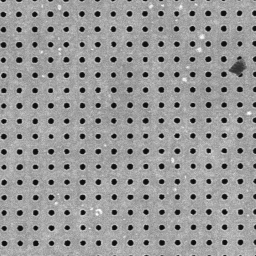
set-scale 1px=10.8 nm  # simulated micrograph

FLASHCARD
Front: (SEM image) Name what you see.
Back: a regular array of holes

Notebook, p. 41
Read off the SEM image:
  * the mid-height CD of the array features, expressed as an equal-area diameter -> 58.3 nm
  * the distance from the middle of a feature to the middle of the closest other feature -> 0.163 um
